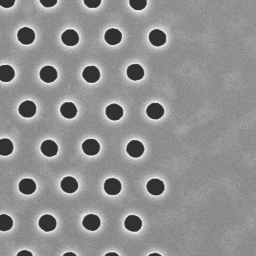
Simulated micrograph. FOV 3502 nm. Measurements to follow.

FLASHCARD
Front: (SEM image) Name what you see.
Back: a regular array of holes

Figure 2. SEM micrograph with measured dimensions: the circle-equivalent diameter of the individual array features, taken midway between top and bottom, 242 nanometers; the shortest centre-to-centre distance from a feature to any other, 0.571 micrometres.